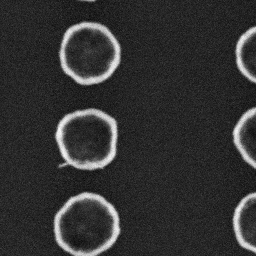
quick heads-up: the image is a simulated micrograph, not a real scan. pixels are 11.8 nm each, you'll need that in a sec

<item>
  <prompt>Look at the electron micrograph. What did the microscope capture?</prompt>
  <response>raised bodies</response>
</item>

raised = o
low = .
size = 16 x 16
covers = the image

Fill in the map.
................
................
....ooo........o
....ooo........o
....ooo........o
................
................
....ooo........o
....ooo........o
....ooo........o
................
................
.....o.........o
....ooo........o
....ooo........o
....oo..........